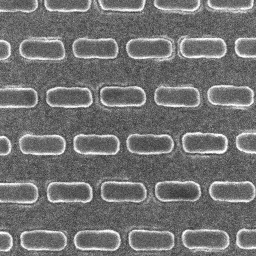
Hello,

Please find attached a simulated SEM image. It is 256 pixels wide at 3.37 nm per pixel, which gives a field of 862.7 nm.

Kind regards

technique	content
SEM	a regular array of raised bodies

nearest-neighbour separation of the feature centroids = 181 nm